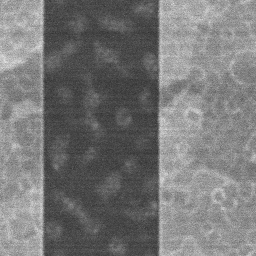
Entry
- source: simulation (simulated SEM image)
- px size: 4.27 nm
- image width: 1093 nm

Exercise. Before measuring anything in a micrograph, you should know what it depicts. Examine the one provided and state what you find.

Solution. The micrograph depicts one or a few lines or trenches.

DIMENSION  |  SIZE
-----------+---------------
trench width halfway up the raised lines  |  502 nanometres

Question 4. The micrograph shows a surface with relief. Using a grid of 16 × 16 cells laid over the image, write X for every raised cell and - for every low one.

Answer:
XXX-------XXXXXX
XXX-------XXXXXX
XXX-------XXXXXX
XXX-------XXXXXX
XXX-------XXXXXX
XXX-------XXXXXX
XXX-------XXXXXX
XXX-------XXXXXX
XXX-------XXXXXX
XXX-------XXXXXX
XXX-------XXXXXX
XXX-------XXXXXX
XXX-------XXXXXX
XXX-------XXXXXX
XXX-------XXXXXX
XXX-------XXXXXX